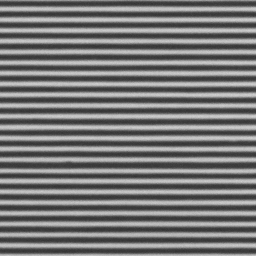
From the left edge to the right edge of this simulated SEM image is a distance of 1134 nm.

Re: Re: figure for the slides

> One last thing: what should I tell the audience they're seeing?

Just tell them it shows parallel lines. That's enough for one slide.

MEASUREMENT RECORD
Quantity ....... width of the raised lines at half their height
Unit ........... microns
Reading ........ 0.0172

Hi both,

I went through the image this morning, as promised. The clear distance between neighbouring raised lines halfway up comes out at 29.9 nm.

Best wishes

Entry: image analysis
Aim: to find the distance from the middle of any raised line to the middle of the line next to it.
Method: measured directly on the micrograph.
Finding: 47.7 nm